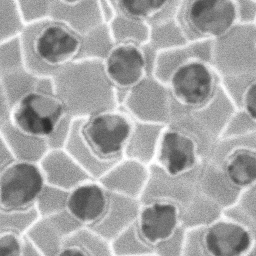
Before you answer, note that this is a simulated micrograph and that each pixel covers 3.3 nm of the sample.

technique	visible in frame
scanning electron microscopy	a regular array of raised bodies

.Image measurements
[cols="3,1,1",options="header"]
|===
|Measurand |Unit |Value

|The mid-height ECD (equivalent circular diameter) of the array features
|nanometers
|137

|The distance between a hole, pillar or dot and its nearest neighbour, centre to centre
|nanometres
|175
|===